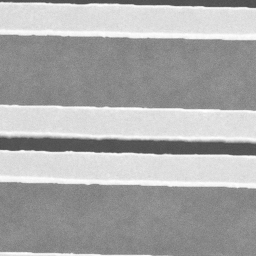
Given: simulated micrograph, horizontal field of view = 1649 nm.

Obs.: lines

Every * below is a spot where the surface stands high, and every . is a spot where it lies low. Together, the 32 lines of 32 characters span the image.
*******.........................
********************************
********************************
********************************
................****************
................................
................................
................................
................................
................................
................................
................................
................................
************.*..................
********************************
********************************
********************************
.......................*********
................................
*****************************...
********************************
********************************
********************************
................................
................................
................................
................................
................................
................................
................................
................................
................................